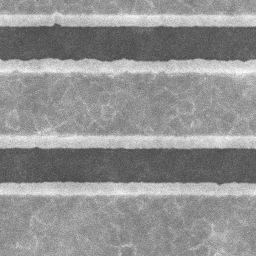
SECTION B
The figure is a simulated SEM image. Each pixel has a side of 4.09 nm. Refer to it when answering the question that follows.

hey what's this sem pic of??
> one or a few lines or trenches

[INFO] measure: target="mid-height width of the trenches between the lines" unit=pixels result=47.1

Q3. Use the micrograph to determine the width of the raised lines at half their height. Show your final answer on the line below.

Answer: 0.309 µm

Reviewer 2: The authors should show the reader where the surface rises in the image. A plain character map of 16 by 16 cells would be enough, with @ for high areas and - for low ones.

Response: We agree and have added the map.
@@@@@@@@@@@@@@@@
----------------
----------------
----------------
@@@@@@@@@@@@@@@@
@@@@@@@@@@@@@@@@
@@@@@@@@@@@@@@@@
@@@@@@@@@@@@@@@@
@@@@@@@@@@@@@@@@
----------------
----------------
----------------
@@@@@@@@@@@@@@@@
@@@@@@@@@@@@@@@@
@@@@@@@@@@@@@@@@
@@@@@@@@@@@@@@@@